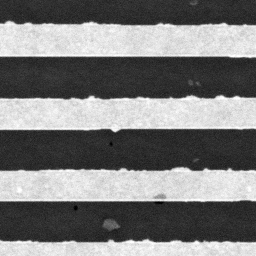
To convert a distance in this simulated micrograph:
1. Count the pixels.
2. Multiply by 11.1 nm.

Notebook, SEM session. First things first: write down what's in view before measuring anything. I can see lines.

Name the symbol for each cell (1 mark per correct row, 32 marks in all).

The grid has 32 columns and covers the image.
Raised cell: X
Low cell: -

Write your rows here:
--------------------------------
--------------------------------
--------------------------------
XXXXXXXXXXXXXXXXXXXXXXXXXXXXXXXX
XXXXXXXXXXXXXXXXXXXXXXXXXXXXXXXX
XXXXXXXXXXXXXXXXXXXXXXXXXXXXXXXX
XXXXXXXXXXXXXXXXXXXXXXXXXXXXXXXX
--------------------------------
--------------------------------
--------------------------------
--------------------------------
--------------------------------
XXXXX-XX-X-X--XXXXXXXXXXXXXXXXXX
XXXXXXXXXXXXXXXXXXXXXXXXXXXXXXXX
XXXXXXXXXXXXXXXXXXXXXXXXXXXXXXXX
XXXXXXXXXXXXXXXXXXXXXXXXXXXXXXXX
--------------------------------
--------------------------------
--------------------------------
--------------------------------
--------------------------------
XXXXXXXXXXXXXXXXXXXXXXXXXXXXXXXX
XXXXXXXXXXXXXXXXXXXXXXXXXXXXXXXX
XXXXXXXXXXXXXXXXXXXXXXXXXXXXXXXX
XXXXXXXXXXXXXXXXXXXXXXXXXXXXXXXX
--------------------------------
--------------------------------
--------------------------------
--------------------------------
--------------------------------
XXXXXXXXXXXXXXXXXXXXXXXXXXXXXXXX
XXXXXXXXXXXXXXXXXXXXXXXXXXXXXXXX